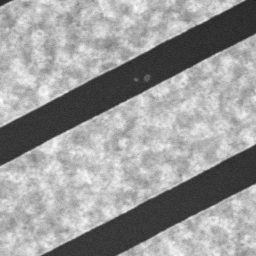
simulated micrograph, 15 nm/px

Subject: one or a few lines or trenches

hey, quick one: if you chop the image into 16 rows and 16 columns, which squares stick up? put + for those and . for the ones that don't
++++++++++++++..
++++++++++++....
++++++++++.....+
+++++++++....+++
+++++++....+++++
+++++.....++++++
+++.....++++++++
+.....++++++++++
....++++++++++++
..+++++++++++++.
+++++++++++++...
+++++++++++.....
+++++++++.....++
+++++++.....++++
+++++.....++++++
+++.....++++++++